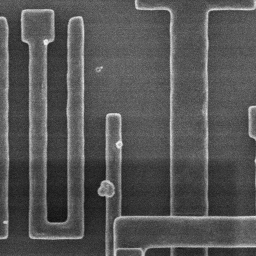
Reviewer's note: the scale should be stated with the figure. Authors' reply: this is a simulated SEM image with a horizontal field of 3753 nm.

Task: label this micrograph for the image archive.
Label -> wiring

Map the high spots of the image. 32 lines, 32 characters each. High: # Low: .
................................
................................
................................
................................
................................
................................
................................
................................
................................
................................
................................
................................
................................
................................
................................
................................
................................
................................
................................
................................
................................
................................
................................
................................
................................
................................
................................
..............##################
..............##################
..............##################
..............##################
..............####..............